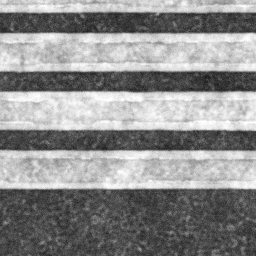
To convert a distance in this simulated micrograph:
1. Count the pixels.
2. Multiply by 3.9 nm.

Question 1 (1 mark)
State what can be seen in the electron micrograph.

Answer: parallel lines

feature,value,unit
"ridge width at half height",127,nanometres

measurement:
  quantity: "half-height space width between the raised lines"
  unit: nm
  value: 100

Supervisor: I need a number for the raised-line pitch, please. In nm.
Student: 229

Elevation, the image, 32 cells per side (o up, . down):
oooooooooooooooooooooooooooooooo
................................
................................
................................
................................
oooooooooooooooooooooooooooooooo
oooooooooooooooooooooooooooooooo
oooooooooooooooooooooooooooooooo
..o.............................
................................
................................
................................
oooooooooooooooooooooooooooooooo
oooooooooooooooooooooooooooooooo
oooooooooooooooooooooooooooooooo
oooooooooooooooooooooooooooooooo
................................
................................
................................
oooooooooooooooooooooooooooooooo
oooooooooooooooooooooooooooooooo
oooooooooooooooooooooooooooooooo
oooooooooooooooooooooooooooooooo
................................
................................
................................
................................
................................
................................
................................
................................
................................